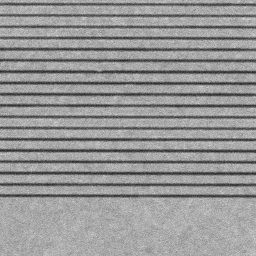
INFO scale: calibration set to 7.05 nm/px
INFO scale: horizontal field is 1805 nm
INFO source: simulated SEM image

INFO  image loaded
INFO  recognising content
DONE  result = parallel lines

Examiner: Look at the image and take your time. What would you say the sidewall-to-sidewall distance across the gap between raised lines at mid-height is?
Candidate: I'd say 23.8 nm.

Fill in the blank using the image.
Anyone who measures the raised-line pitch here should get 79.5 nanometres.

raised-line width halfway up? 54.7 nm